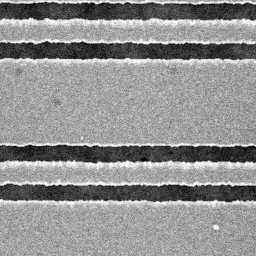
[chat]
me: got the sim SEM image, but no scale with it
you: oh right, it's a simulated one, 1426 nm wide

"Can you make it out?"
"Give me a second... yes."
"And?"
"lines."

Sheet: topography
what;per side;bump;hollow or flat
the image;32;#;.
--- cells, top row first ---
................................
................................
.........#.........#............
################################
################################
................................
................................
####.#.###.######.##.....###....
################################
################################
################################
################################
################################
################################
################################
################################
################################
################################
................................
................................
##########.....####.##..#####...
################################
################################
................................
................................
################################
################################
################################
################################
################################
################################
################################